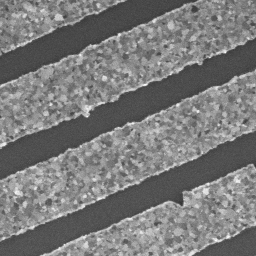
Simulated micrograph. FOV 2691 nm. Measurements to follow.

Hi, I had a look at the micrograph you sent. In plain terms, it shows one or a few lines or trenches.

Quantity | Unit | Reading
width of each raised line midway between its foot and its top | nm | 585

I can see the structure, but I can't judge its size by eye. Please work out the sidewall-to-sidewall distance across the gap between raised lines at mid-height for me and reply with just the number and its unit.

326 nanometres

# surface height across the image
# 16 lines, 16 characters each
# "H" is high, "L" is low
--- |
HHHHHHHLLLLHHHHH
HHHHLLLLLHHHHHHH
HHLLLLLHHHHHHHHH
LLLLLHHHHHHHHLLL
LLHHHHHHHHHLLLLL
HHHHHHHHLLLLLHHH
HHHHHHLLLLLHHHHH
HHHHLLLLLHHHHHHH
HLLLLLHHHHHHHHHL
LLLLHHHHHHHHHLLL
LLHHHHHHHHHLLLLH
HHHHHHHHLLLLLHHH
HHHHHHLLLLLHHHHH
HHHHLLLLLHHHHHHH
HLLLLLHHHHHHHHHL
LLLLHHHHHHHHHLLL